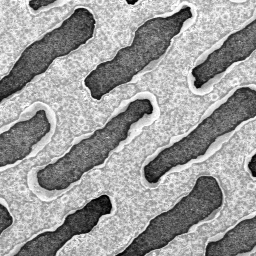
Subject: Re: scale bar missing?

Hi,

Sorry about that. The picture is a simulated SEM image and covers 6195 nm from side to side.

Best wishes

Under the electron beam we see holes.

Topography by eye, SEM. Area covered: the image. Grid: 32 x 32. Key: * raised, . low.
****...*********.***************
*********..***********..********
********....*******....*********
*******.....*****......*******..
*****.......*****.....*******...
****......******.....*******....
***......******......******.....
**.....*******......*****.....**
*.....******.......*****.....***
*....******......*******....****
...********....*********..******
..*********...***************...
*****************..*********....
****..*********....********.....
***...********.....*******......
**.....******....********.....**
*......*****....********.....***
......****......******......****
.....****......******.....******
...*****......*****......*******
.*****.......*****.....********.
****.......*******...**********.
****......********..*****..*****
****.....***************....****
******.*****.**********.....****
***********...********......****
.********.....*******......*****
..******....*******.......****..
.******.....******......*****...
*****....********.....******....
***.....********.....*****......
**.....********....*******.....*